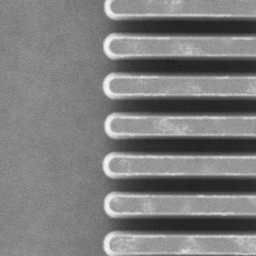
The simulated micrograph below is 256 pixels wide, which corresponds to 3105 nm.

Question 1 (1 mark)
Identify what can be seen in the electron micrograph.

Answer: parallel lines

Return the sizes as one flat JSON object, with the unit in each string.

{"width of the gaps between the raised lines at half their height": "223 nanometres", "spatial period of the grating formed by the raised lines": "481 nm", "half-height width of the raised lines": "255 nanometres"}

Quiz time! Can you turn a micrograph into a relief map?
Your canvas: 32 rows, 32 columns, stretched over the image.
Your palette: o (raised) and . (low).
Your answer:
.............ooooooooooooooooooo
..............oooooooooooooooooo
................................
................................
.................ooooo..........
.............ooooooooooooooooooo
..............oooooooooooooooooo
................................
................................
..............ooooo.............
.............ooooooooooooooooooo
..............oooooooooooooooooo
................................
................................
......................oooooooooo
..............oooooooooooooooooo
..............oooooooooooooooooo
................................
................................
..............oooooooooooooooooo
.............ooooooooooooooooooo
..............oooooooooooooooooo
................................
................................
..............oooooooooooooooooo
.............ooooooooooooooooooo
..............oooooooooooooooooo
................................
................................
..............oooooooooooooooooo
.............ooooooooooooooooooo
..............oooooooooooooooooo